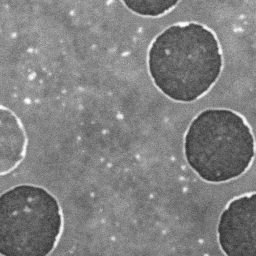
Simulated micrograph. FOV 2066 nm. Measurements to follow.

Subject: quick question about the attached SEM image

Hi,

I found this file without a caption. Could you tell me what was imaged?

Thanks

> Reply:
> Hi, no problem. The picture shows holes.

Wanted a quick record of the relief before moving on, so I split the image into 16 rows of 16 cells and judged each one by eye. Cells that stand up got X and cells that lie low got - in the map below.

XXXXXXXX---XXXXX
XXXXXXXXXXXXXXXX
XXXXXXXXXX---XXX
XXXXXXXXX-----XX
XXXXXXXXX-----XX
XXXXXXXXXX---XXX
XXXXXXXXXXXXXXXX
XXXXXXXXXXXX---X
XXXXXXXXXXXX----
XXXXXXXXXXXX----
XXXXXXXXXXXX---X
XXXXXXXXXXXXXXXX
---XXXXXXXXXXXX-
----XXXXXXXXXX--
----XXXXXXXXXX--
---XXXXXXXXXXX--